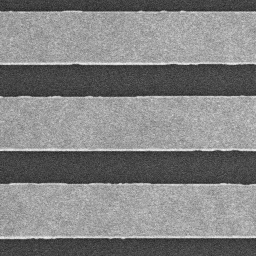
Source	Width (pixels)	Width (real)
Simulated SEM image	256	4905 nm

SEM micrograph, lines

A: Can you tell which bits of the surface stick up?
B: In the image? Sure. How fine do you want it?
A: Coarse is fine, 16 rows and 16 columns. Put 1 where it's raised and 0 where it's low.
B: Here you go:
0000000000000000
1111111111111111
1111111111111111
1111111111111111
0000000000000000
0000000000000000
1111111111111111
1111111111111111
1111111111111111
0000000000000000
0000000000000000
1111111111000110
1111111111111111
1111111111111111
1111111111111111
0000000000000000